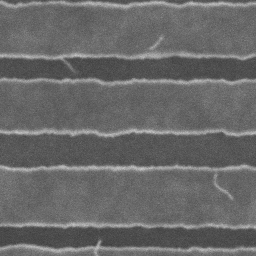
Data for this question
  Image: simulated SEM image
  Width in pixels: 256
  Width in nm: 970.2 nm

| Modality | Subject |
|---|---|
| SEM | lines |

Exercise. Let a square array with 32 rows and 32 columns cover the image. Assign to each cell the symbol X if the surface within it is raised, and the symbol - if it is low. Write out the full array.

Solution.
X-XXXXXXXXXXXXX-XXXXXX-XXXXXXXXX
XXXXXXXXXXXXXXXXXXXXXXXXXXXXXXXX
XXXXXXXXXXXXXXXXXXXXXXXXXXXXXXXX
XXXXXXXXXXXXXXXXXXXXXXXXXXXXXXXX
XXXXXXXXXXXXXXXXXXXXXXXXXXXXXXXX
XXXXXXXXXXXXXXXXXXXXXXXXXXXXXXXX
XXXXXXXXXXXXXXXXXXXXXXXXXXXXXXXX
--------------------------------
--------------------------------
--------------------------------
XXXXXXXXXXXXXXXXXXXXXXXXXXXXXXXX
XXXXXXXXXXXXXXXXXXXXXXXXXXXXXXXX
XXXXXXXXXXXXXXXXXXXXXXXXXXXXXXXX
XXXXXXXXXXXXXXXXXXXXXXXXXXXXXXXX
XXXXXXXXXXXXXXXXXXXXXXXXXXXXXXXX
XXXXXXXXXXXXXXXXXXXXXXXXXXXXXXXX
XXXXXXXXXXXXXXXXXXXXXXXXXXXXXXXX
--------------------------------
--------------------------------
--------------------------------
--------------------------------
XXXXXXXXXXXXXXXXXXXXXXXXXXXXXXXX
XXXXXXXXXXXXXXXXXXXXXXXXXXXXXXXX
XXXXXXXXXXXXXXXXXXXXXXXXXXXXXXXX
XXXXXXXXXXXXXXXXXXXXXXXXXXXXXXXX
XXXXXXXXXXXXXXXXXXXXXXXXXXXXXXXX
XXXXXXXXXXXXXXXXXXXXXXXXXXXXXXXX
XXXXXXXXXXXXXXXXXXXXXXXXXXXXXXXX
------------------X----XX---XXXX
--------------------------------
--------------------------------
XXXXXXXXXXXXXXXXXXXXXXXXXXXXXXXX